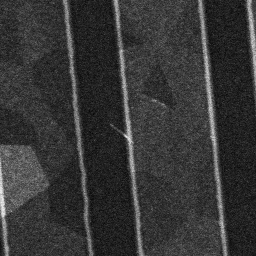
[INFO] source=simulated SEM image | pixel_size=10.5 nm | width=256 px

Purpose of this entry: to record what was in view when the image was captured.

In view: one or a few lines or trenches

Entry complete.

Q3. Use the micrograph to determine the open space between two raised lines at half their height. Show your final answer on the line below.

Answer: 525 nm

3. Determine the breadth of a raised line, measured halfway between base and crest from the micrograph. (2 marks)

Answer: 879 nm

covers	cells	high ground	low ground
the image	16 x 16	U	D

UUUUDDDUUUUUUDDD
UUUUDDDUUUUUUDDD
UUUUDDDUUUUUUDDD
UUUUDDDDUUUUUDDD
UUUUUDDDUUUUUDDD
UUUUUDDDUUUUUDDD
UUUUUDDDUUUUUDDD
UUUUUDDDUUUUUDDD
UUUUUDDDUUUUUDDD
UUUUUDDDUUUUUDDD
UUUUUDDDUUUUUUDD
UUUUUDDDUUUUUUDD
UUUUUDDDUUUUUUDD
UUUUUDDDDUUUUUDD
UUUUUUDDDUUUUUDD
UUUUUUDDDUUUUUDD